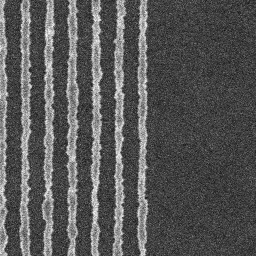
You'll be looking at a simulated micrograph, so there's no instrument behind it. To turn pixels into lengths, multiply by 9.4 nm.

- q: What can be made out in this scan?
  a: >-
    parallel lines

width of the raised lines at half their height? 6.87 px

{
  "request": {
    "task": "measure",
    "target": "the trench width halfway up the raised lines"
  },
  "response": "157 nanometres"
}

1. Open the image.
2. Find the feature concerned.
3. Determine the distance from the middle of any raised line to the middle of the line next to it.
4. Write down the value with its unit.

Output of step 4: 220 nanometres